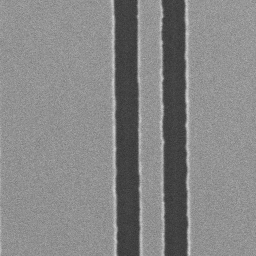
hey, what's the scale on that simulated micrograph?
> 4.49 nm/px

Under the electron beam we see lines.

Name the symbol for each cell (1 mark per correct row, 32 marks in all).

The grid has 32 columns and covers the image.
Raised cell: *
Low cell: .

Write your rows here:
**************...***...*********
**************...***...*********
**************...***...*********
**************...***...*********
**************...***...*********
**************...***...*********
**************...***...*********
**************...***...*********
**************...***...*********
**************...***...*********
**************...***...*********
**************...***...*********
**************...***...*********
**************...***...*********
**************...***...*********
**************...***...*********
**************...***...*********
**************...***...*********
**************...***...*********
**************...***...*********
**************...***...*********
**************...***...*********
**************....**...*********
**************...***...*********
**************....**...*********
**************....**...*********
**************....**...*********
**************....**...*********
***************...**...*********
**************....**...*********
**************....**...*********
**************....**...*********